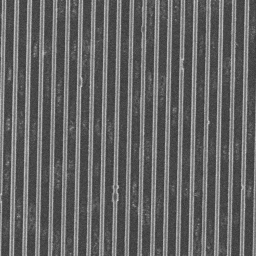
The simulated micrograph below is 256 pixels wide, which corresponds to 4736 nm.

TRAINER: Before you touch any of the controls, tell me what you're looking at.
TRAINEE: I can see parallel lines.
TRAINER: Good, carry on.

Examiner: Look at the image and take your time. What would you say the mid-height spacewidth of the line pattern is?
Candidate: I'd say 178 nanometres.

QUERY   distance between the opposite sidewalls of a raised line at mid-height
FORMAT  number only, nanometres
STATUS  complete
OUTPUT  71.7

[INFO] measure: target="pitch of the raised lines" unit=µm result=0.236